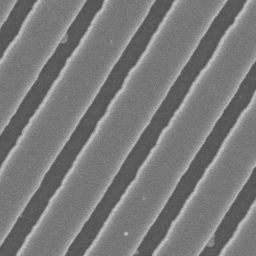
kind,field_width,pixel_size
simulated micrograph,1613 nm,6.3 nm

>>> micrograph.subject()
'lines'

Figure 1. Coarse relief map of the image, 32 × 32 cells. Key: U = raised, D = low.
UUDDUUUUUUDDDUUUUUUDDDUUUUUUDDDU
UDDDUUUUUUDDUUUUUUUDDUUUUUUDDDUU
UDDUUUUUUDDDUUUUUUDDUUUUUUUDDUUU
DDDUUUUUUDDUUUUUUDDDUUUUUUDDDUUU
DDUUUUUUDDUUUUUUUDDUUUUUUDDDUUUU
DUUUUUUDDDUUUUUUDDUUUUUUUDDUUUUU
DUUUUUUDDUUUUUUDDDUUUUUUDDDUUUUU
UUUUUUDDUUUUUUUDDUUUUUUUDDUUUUUU
UUUUUDDDUUUUUUDDUUUUUUUDDUUUUUUD
UUUUUDDUUUUUUDDDUUUUUUDDDUUUUUUD
UUUUDDDUUUUUUDDUUUUUUUDDUUUUUUDD
UUUUDDUUUUUUDDDUUUUUUDDDUUUUUUDD
UUUDDUUUUUUUDDUUUUUUDDDUUUUUUDDU
UUDDDUUUUUUDDUUUUUUUDDUUUUUUDDDU
UUDDUUUUUUDDDUUUUUUDDDUUUUUUDDUU
UDDUUUUUUUDDUUUUUUUDDUUUUUUDDUUU
DDDUUUUUUDDDUUUUUUDDUUUUUUDDDUUU
DDUUUUUUDDDUUUUUUDDDUUUUUUDDUUUU
DDUUUUUUDDUUUUUUUDDUUUUUUDDUUUUU
DUUUUUUDDDUUUUUUDDUUUUUUDDDUUUUU
UUUUUUUDDUUUUUUDDDUUUUUUDDUUUUUU
UUUUUUDDUUUUUUUDDUUUUUUDDUUUUUUD
UUUUUDDDUUUUUUDDDUUUUUDDDUUUUUUD
UUUUUDDUUUUUUDDDUUUUUUDDUUUUUUDD
UUUUDDDUUUUUUDDUUUUUUDDDUUUUUUDD
UUUDDDUUUUUUDDDUUUUUUDDUUUUUUDDU
UUUDDUUUUUUUDDUUUUUUDDUUUUUUDDDU
UUDDDUUUUUUDDUUUUUUDDDUUUUUUDDUU
UUDDUUUUUUDDDUUUUUUDDUUUUUUDDDUU
UDDUUUUUUUDDUUUUUUDDDUUUUUDDDUUU
DDDUUUUUUDDUUUUUUUDDUUUUUUDDUUUU
DDUUUUUUDDDUUUUUUDDUUUUUUDDDUUUU